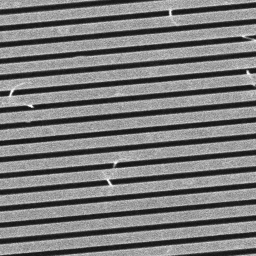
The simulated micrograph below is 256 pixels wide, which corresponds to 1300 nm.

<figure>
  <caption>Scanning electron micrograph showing parallel lines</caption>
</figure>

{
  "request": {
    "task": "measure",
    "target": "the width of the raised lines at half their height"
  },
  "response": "55 nm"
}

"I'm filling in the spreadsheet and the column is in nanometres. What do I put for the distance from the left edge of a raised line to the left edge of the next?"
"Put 82.8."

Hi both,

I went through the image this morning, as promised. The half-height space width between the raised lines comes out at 25.3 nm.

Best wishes